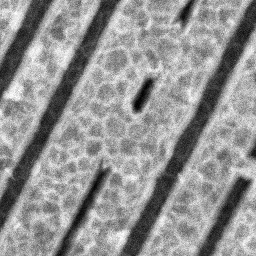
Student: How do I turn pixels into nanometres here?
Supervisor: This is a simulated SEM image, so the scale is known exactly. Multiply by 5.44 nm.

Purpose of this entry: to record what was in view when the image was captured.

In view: one or a few lines or trenches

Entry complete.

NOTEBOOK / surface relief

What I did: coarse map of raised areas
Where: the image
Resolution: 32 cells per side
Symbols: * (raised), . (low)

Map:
***....*****...********..******.
***...*****....*******..******..
**....*****...********..*****...
**...*****....***************...
*....*****...***************....
*...*****....***************...*
....*****...***************....*
...*****....***************...**
...*****...***************....**
..*****....***************...***
..*****...********.******....***
.*****....*******..******...****
.*****...********..******...****
*****....*******..******...*****
*****...****************...*****
****....***************...******
****...***************....******
***....***************...*******
***...***************....******.
**...****************...*******.
**...***************....********
*...********..******...*********
*...*******..******....******...
...********..******...*******..*
...*******..******....******...*
..********..******...******...**
..*******..******....******...**
.********..******...******...***
.*******..******....******...***
********..*****....******...****
*******..******....******...****
*******..******...******...*****